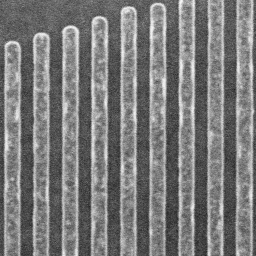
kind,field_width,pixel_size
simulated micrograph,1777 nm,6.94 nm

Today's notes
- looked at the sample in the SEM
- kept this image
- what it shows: parallel lines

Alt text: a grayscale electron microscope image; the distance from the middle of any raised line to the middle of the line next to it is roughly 202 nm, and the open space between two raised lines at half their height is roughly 96.3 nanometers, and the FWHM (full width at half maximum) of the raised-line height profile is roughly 0.109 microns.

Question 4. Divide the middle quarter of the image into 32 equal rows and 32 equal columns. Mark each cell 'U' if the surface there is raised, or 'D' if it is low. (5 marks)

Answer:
UUUUDDDUUUUDDDUUUUDDDDUUUDDDDUDU
UUUUDDDUUUUDDDUUUUDDDDUUUDDDDUDU
UUUDDDDUUUUDDDUUUUDDDDUUUDDDDUUU
UUUDDDDUUUUDDDUUUUDDDDUUUDDDDUUU
UUUDDDDUUUUDDDUUUUDDDDUDDDDDDUUU
UUUDDDDUUUUDDDUUUUDDDDUUDDDDDUUU
UUUDDDDUUUUDDDUUUUDDDDUUUDDDDUUU
UUUDDDDUUUUDDDUUUUDDDDUUUDDDDUUU
UUUUDDDUUUUDDDUUUUDDDDUUUDDDDUUU
UUUUDDDUUDUDDDUUUUDDDDUUUDDDDUUU
UUUDDDDUUUUDDDUUUUDDDDUUUDDDDUUU
UUUDDDDUUUUDDDUUUUDDDDUUUDDDDUUU
UUUDDDDUUUUDDDUUUUDDDDUUUDDDDUDU
UUUDDDDUUUUDDDUUUUDDDDUUUDDDDUUU
UUUDDDDUUUUDDDUUUUDDDDUUUDDDDUUU
UUUDDDDUUUUDDDUUUUDDDDUUUDDDDUUU
UUUDDDDUUUUDDDUUUUDDDDUUUDDDDUUU
UUUDDDDUUUUDDDUUUUDDDDUUUDDDDUUU
UUUDDDDUUUUDDDUUUUDDDDUUUDDDDUUU
UUUDDDDUUUUDDDUUUUDDDDUUUDDDDUUU
UUUDDDDUUUUDDDUUUUDDDDUUUDDDDUUU
UUUDDDDUUUUDDDUUUUDDDDUUUDDDDUUU
UUUDDDDUUUUDDDUUUUDDDDUUUDDDDUUU
UUUDDDDUUUUDDDUUUUDDDDUUUDDDDUUU
UUUDDDDUUUUDDDUUUUDDDDUUUDDDDUUU
UUUDDDDUUUUDDDUUUUDDDDUUUDDDDUUU
UUUDDDDUUUUDDDUUUUDDDDUUUDDDDUUU
UUUDDDDUUUUDDDUUUUDDDUUUUDDDDUUU
UUUDDDDUUUUDDDUUUUDDDUUUUDDDDUUU
UUUDDDDUUUUDDDUUUUDDDUUUUDDDDUUU
UUUDDDDUUUUDDDUUUUDDDUUUUDDDDUUU
UUUDDDDUUUUDDDUUUUDDDUUUUDDDDUUU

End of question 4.